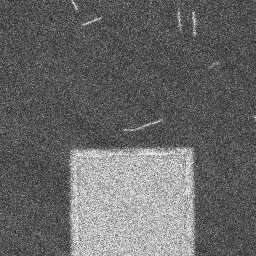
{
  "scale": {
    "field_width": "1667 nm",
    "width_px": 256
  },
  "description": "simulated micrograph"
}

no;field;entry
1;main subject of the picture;one or a few lines or trenches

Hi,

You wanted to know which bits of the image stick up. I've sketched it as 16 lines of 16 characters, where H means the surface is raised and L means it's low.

HHHHHHHHHHHHHHHH
HHHHHHHHHHHHHHHH
HHHHHHHHHHHHHHHH
HHHHHHHHHHHHHHHH
HHHHHHHHHHHHHHHH
HHHHHHHHHHHHHHHH
HHHHHHHHHHHHHHHH
HHHHHHHHHHHHHHHH
HHHHHHHHHHHHHHHH
HHHHHHHHHHLHHHHH
HHHHHLLLLLLLHHHH
HHHHHLLLLLLLHHHH
HHHHHLLLLLLLHHHH
HHHHHLLLLLLLHHHH
HHHHHLLLLLLLHHHH
HHHHHLLLLLLLHHHH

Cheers